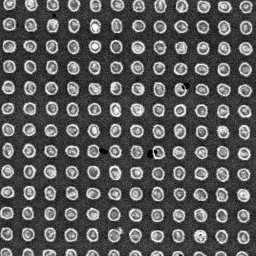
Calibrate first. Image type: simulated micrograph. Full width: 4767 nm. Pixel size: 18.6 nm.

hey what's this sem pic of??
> a regular array of raised bodies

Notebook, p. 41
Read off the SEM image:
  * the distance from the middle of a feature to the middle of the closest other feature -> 384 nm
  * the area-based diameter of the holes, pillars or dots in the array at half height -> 214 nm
